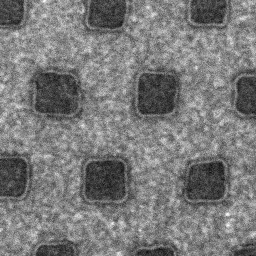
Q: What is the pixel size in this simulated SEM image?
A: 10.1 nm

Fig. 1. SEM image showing raised bodies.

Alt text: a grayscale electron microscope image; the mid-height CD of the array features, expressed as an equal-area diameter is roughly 470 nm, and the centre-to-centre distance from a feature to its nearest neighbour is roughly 1000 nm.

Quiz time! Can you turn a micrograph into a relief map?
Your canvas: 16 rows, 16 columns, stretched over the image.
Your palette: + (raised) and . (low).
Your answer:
++....++....++..
+.....++....++..
................
................
................
..+++....++....+
..+++....++....+
................
................
................
++...+++....++..
++...+++....++..
......++....++..
................
................
..+++....++....+